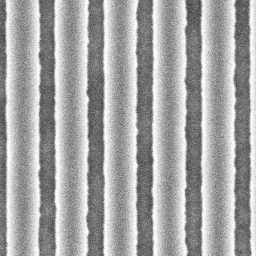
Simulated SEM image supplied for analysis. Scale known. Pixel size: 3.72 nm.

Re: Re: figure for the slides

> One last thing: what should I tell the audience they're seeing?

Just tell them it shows lines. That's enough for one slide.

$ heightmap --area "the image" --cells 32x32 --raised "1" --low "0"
01111001111001111001111001111001
01111001111001111001111001111001
01111001111001111001111001111001
01111001111001111001111001111001
01111001111001111001111001111001
01111001111001111001111001111001
01111001111001111001111001111001
01111001111001111001111001111001
01111001111001111001111001111001
01111001111001111001111001111001
01111001111001111001111001111001
01111001111001111001111001111001
01111001111001111001111001111001
01111001111001111001111001111001
01111001111001111001111001111001
01111001111001111001111001111001
01111001111001111001111001111001
01111001111001111001111001111001
01111001111001111001111001111001
01111001111001111001111001111001
01111001111001111001111001111001
01111001111001111001111001111001
01111001111001111001111001111001
01111001111001111001111001111001
01111001111001111001111001111001
01111001111001111001111001111001
01111001111001111001111001111001
01111001111001111001111001111001
01111001111001111001111001111001
01111001111001111001111001111001
01111001111001111001111001111001
01111001111001111001111001111001